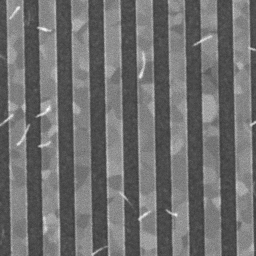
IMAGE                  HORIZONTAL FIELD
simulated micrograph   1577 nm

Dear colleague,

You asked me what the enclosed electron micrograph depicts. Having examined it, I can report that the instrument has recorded parallel lines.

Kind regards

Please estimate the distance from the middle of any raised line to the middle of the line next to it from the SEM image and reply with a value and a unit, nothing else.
199 nm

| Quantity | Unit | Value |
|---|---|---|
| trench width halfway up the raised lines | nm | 98.5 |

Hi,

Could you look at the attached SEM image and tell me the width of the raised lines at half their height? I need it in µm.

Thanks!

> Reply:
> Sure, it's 0.0985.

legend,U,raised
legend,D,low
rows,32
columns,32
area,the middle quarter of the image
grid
DDUUUUDDDDUUUUDDDDUUUUDDDDDUUUDD
DDUUUUDDDDUUUUDDDDUUUUDDDDDUUUDD
DDUUUUDDDDUUUUDDDDUUUUDDDDDUUUDD
DDUUUUDDDDUUUUDDDDUUUUDDDDDUUUDD
DDUUUUDDDDUUUUDDDDUUUUDDDDDUUUDD
DDUUUUDDDDUUUUDDDDUUUUDDDDDUUUDD
DDUUUUDDDDUUUUDDDDUUUUDDDDDUUUDD
DDUUUUDDDDUUUUDDDDUUUUDDDDDUUUDD
DDUUUUDDDDDUUUDDDDDUUUDDDDDUUUDD
DDDUUUDDDDDUUUDDDDDUUUDDDDDUUUDD
DDUUUUDDDDDUUUDDDDDUUUDDDDDUUUDD
DDDUUUDDDDDUUUDDDDDUUUUDDDDUUUUD
DDUUUUDDDDDUUUDDDDDUUUUDDDDUUUUD
DDDUUUDDDDDUUUDDDDDUUUUDDDDUUUUD
DDDUUUDDDDDUUUDDDDDUUUUDDDDUUUUD
DDDUUUDDDDDUUUDDDDDUUUUDDDDUUUUD
DDDUUUDDDDDUUUDDDDDUUUUDDDDUUUUD
DDDUUUDDDDDUUUDDDDDUUUUDDDDUUUUD
DDDUUUDDDDDUUUDDDDDUUUUDDDDUUUUD
DDDUUUDDDDDUUUDDDDDUUUUDDDDUUUUD
DDDUUUDDDDDUUUDDDDDUUUUDDDDUUUUD
DDDUUUUDDDDUUUUDDDDUUUUDDDDUUUUD
DDDUUUUDDDDUUUUDDDDUUUUDDDDUUUUD
DDDUUUUDDDDUUUUDDDDUUUUDDDDUUUUD
DDDUUUUDDDDUUUUDDDDUUUUDDDDUUUUD
DDDUUUUDDDDUUUUDDDDUUUUDDDDUUUUD
DDDUUUUDDDDUUUUDDDDUUUUDDDDUUUUD
DDDUUUUDDDDUUUUDDDDUUUUDDDDUUUUD
DDDUUUUDDDDUUUUDDDDUUUUDDDDUUUUD
DDDUUUUDDDDUUUUDDDDUUUUDDDDUUUUD
DDDUUUUDDDDUUUUDDDDUUUUDDDDUUUUD
DDDUUUUDDDDUUUUDDDDUUUUDDDDUUUUD